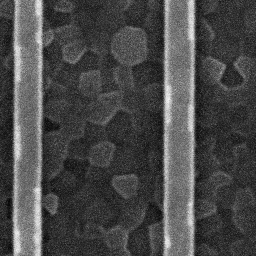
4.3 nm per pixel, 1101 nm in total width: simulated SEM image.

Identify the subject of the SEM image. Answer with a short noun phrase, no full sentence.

one or a few lines or trenches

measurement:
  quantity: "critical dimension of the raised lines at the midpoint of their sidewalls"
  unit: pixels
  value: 26